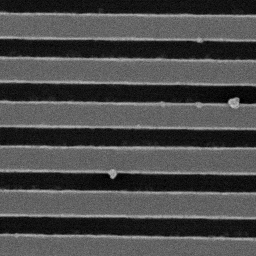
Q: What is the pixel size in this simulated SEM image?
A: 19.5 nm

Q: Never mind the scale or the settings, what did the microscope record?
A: lines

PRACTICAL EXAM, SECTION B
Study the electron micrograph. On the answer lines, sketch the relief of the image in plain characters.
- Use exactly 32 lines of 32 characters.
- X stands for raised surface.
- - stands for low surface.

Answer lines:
--------------------------------
--------------------------------
XXXXXXXXXXXXXXXXXXXXXXXXXXXXXXXX
XXXXXXXXXXXXXXXXXXXXXXXXXXXXXXXX
XXXXXXXXXXXXXXXXXXXXXXXXXXXXXXXX
--------------------------------
--------------------------------
XXXXXXXXXXXXXXXXXXXXXXXXXXX-----
XXXXXXXXXXXXXXXXXXXXXXXXXXXXXXXX
XXXXXXXXXXXXXXXXXXXXXXXXXXXXXXXX
---------------XXXXXXXXXXXXXXXXX
--------------------------------
-----------------------------X--
XXXXXXXXXXXXXXXXXXXXXXXXXXXXXXXX
XXXXXXXXXXXXXXXXXXXXXXXXXXXXXXXX
XXXXXXXXXXXXXXXXXXXXXXXXXXXXXXXX
--------------------------------
--------------------------------
XXXXXXXXXXXXXXXXXXXXXXXXXXXXXXXX
XXXXXXXXXXXXXXXXXXXXXXXXXXXXXXXX
XXXXXXXXXXXXXXXXXXXXXXXXXXXXXXXX
---------XXXXXXXXXXXXXXXXXXXXXXX
--------------------------------
--------------------------------
XXXXXXXXXXXXXXXXXXXXXXXXXXXXXXXX
XXXXXXXXXXXXXXXXXXXXXXXXXXXXXXXX
XXXXXXXXXXXXXXXXXXXXXXXXXXXXXXXX
--------------------------------
--------------------------------
XXXXXXXXXXXXXXX-----------------
XXXXXXXXXXXXXXXXXXXXXXXXXXXXXXXX
XXXXXXXXXXXXXXXXXXXXXXXXXXXXXXXX